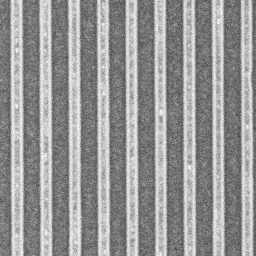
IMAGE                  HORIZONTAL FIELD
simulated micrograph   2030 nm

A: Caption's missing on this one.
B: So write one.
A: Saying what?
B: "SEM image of parallel lines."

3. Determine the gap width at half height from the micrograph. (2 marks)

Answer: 158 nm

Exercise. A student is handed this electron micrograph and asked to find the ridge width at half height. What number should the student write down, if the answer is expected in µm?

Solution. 0.0684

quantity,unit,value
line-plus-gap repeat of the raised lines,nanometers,228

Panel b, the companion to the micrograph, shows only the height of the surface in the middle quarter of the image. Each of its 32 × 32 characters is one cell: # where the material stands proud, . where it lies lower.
..##.....##.....##.....##.....##
..##.....##.....##.....##.....##
..##.....##.....##.....##.....##
..##.....##.....##.....##.....##
..##.....##.....##.....##.....##
..##.....##.....##.....##.....##
..##.....##.....##.....##.....##
..##.....##.....##.....##.....##
..##.....##.....##.....##.....##
..##.....##.....##.....##.....##
..##.....##.....##.....##.....##
..##.....##.....##.....##.....##
..##.....##.....##.....##.....##
..##.....##.....##.....##.....##
..##.....##.....##.....##.....##
..##.....##.....##.....##.....##
..##.....##.....##.....##.....##
..##.....##.....##.....##.....##
..##.....##.....##.....##.....##
..##.....##.....##.....##.....##
..##.....##.....##.....##.....##
..##.....##.....##.....##.....##
..##.....##.....##.....##.....##
..##.....##.....##.....##.....##
..##.....##.....##.....##.....##
..##.....##.....##.....##.....##
..##.....##.....##.....##.....##
..##.....##.....##.....##.....##
..##.....##.....##.....##.....##
..##.....##.....##.....##.....##
..##.....##.....##.....##.....##
..##.....##.....##.....##.....##